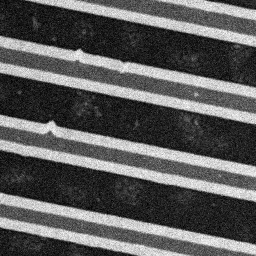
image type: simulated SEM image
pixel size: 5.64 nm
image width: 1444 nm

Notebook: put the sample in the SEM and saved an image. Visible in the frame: one or a few lines or trenches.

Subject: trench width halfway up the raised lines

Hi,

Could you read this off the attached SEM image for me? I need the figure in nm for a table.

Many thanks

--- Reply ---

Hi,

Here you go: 292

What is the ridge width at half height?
141 nm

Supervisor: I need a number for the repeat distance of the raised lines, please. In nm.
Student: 431